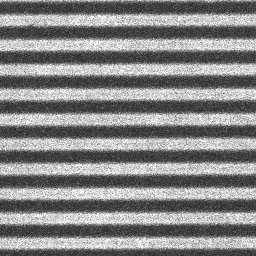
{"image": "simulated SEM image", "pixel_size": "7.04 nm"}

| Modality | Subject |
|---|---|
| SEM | parallel lines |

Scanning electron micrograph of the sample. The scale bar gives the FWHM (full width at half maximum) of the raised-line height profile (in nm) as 76.6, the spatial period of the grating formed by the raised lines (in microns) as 0.174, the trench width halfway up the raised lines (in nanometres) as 96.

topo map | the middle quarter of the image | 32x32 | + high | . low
++++++++++++++++++++++++++++++++
++++++++++++++++++++++++++++++++
++++++++++++++++++++++++++++++++
................................
................................
................................
++++++++++++++++++++++++++++++++
++++++++++++++++++++++++++++++++
++++++++++++++++++++++++++++++++
................................
................................
................................
.......................++..+++++
++++++++++++++++++++++++++++++++
++++++++++++++++++++++++++++++++
................................
................................
................................
................................
++++++++++++++++++++++++++++++++
++++++++++++++++++++++++++++++++
................................
................................
................................
................................
++++++++++++++++++++++++++++++++
++++++++++++++++++++++++++++++++
................................
................................
................................
................................
++++++++++++++++++++++++++++++++